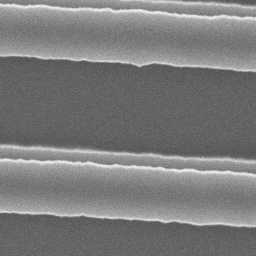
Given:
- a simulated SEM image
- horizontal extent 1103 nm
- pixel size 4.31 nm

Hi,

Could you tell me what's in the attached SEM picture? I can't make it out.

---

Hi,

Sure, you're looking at lines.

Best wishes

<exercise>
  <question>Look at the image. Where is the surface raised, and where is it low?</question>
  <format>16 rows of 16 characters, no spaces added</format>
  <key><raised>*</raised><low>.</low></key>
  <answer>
****************
****************
****************
.***************
................
................
................
................
................
****............
****************
****************
****************
......**********
................
................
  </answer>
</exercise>